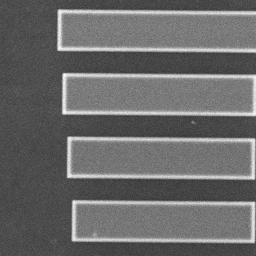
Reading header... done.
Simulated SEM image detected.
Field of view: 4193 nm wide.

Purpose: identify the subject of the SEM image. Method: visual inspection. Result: groups of lines, slits or small figures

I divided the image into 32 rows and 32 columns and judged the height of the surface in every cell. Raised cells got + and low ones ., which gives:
................................
........++++++++++++++..........
.......+++++++++++++++++++++++++
.......+++++++++++++++++++++++++
.......+++++++++++++++++++++++++
.......+++++++++++++++++++++++++
................................
................................
................................
........++++++++++++++++++++....
........++++++++++++++++++++++++
........++++++++++++++++++++++++
........++++++++++++++++++++++++
........++++++++++++++++++++++++
................................
................................
................................
.........++++++++++++++++++++++.
.........+++++++++++++++++++++++
.........+++++++++++++++++++++++
.........+++++++++++++++++++++++
.........+++++++++++++++++++++++
................................
................................
................................
.........++++++++++++++++++++++.
.........+++++++++++++++++++++++
.........+++++++++++++++++++++++
.........+++++++++++++++++++++++
.........+++++++++++++++++++++++
................................
................................